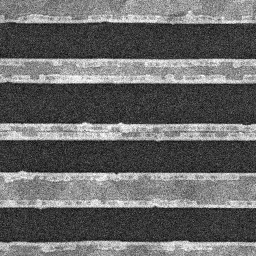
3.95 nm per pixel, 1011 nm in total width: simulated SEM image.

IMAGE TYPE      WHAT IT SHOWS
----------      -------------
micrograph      one or a few lines or trenches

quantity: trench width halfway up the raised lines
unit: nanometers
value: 150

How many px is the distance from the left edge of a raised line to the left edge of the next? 59.6